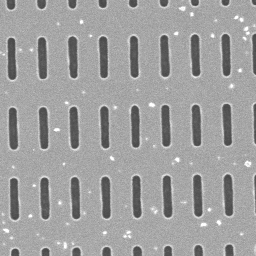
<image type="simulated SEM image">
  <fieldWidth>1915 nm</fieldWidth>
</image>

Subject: a regular array of holes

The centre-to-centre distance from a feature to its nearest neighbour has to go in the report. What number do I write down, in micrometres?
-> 0.228